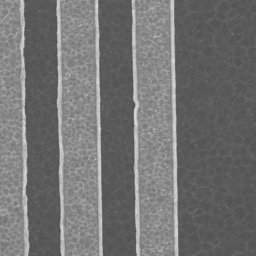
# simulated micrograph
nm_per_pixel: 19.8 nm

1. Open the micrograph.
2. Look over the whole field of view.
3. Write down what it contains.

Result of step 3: one or a few lines or trenches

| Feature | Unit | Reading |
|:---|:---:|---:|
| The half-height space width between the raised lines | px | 35.9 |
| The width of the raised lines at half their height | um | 0.765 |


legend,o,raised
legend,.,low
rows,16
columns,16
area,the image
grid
o...oo..ooo.....
o...oo..ooo.....
o...oo..ooo.....
o...oo..ooo.....
o...oo..ooo.....
o...oo..ooo.....
o...oo..ooo.....
oo..oo..ooo.....
oo..oo..ooo.....
oo..oo...oo.....
oo..oo..ooo.....
oo..oo...oo.....
oo..oo...oo.....
oo..oo...oo.....
oo..oo...oo.....
oo..oo...oo.....